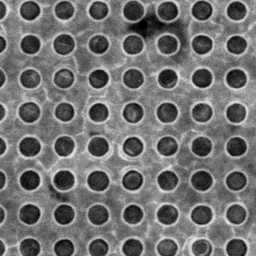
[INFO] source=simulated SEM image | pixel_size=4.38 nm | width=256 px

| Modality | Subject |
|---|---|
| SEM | a regular array of holes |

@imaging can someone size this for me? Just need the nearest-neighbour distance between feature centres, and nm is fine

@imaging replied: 148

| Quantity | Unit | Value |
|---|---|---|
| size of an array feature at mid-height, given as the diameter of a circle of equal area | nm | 91.4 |